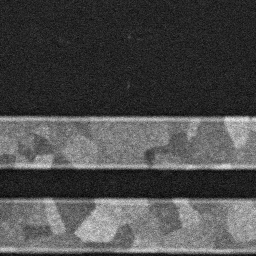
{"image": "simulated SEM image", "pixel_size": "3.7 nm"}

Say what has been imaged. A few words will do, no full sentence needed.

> one or a few lines or trenches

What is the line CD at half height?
0.177 micrometres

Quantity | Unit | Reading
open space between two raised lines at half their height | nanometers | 131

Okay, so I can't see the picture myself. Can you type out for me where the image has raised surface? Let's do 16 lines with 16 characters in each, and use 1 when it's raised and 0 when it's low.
0000000000000000
0000000000000000
0000000000000000
0000000000000000
0000000000000000
0000000000000000
0000000000000000
1111111111111111
1111111111111111
1111111111111111
0000000000000000
0000000000000000
0000000000000000
1111111111111111
1111111111111111
1111111111111111